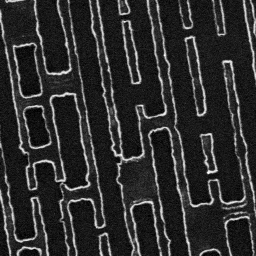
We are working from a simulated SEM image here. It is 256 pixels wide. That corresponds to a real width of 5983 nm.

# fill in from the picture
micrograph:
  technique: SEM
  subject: parallel lines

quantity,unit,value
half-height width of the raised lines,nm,193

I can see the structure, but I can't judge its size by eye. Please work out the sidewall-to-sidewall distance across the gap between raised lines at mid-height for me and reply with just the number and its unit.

514 nm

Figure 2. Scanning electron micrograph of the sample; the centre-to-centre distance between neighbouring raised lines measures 705 nm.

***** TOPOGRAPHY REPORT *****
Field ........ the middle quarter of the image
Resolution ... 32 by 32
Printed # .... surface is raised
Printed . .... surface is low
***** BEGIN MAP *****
..##.....##.....##.....###......
.###.....##......#......##......
####......#......##.....##......
####......##.....##.....##......
####......##.....##.....###.....
####......##.............##.....
#####.....##.............##.....
..###.....##.............##.....
...##.....##.............##.....
...##.....##.............##.....
...##......##.....#......###....
...###.....##.....##.....###....
....##.....##......#.....###....
....##.....##......#########....
....##......#......#########....
....##......##.....#########....
....##.....###.....####...##....
....##......##.....##......##...
....###.....##.....##......##...
....###.....##.....###.....##...
.....##.....##......##.....##...
.....##.....##......##.....###..
.....##......#......##.....###..
......#..........#####.....###..
......##......########......##..
......##......########......##..
......##......#########.....##..
......##......#########.....##..
......##.....##########.....##..
......##.....##########.....###.
......###.....#########.....###.
#########.....#########......##.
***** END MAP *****